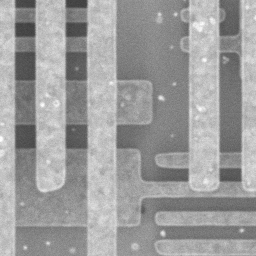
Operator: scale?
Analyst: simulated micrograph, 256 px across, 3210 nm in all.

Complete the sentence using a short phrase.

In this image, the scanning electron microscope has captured wiring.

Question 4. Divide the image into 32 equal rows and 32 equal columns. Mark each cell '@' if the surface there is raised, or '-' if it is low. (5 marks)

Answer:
@@---@@@---@@@----------@@@---@@
@@---@@@---@@@----------@@@---@@
@@---@@@---@@@----------@@@---@@
@@---@@@---@@@----------@@@---@@
@@---@@@---@@@----------@@@---@@
@@---@@@---@@@----------@@@---@@
@@---@@@---@@@----------@@@---@@
@@---@@@---@@@----------@@@---@@
@@---@@@---@@@----------@@@---@@
@@---@@@---@@@----------@@@---@@
@@---@@@---@@@----------@@@---@@
@@---@@@---@@@----------@@@---@@
@@---@@@---@@@----------@@@---@@
@@---@@@---@@@----------@@@---@@
@@---@@@---@@@----------@@@---@@
@@---@@@---@@@----------@@@---@@
@@---@@@---@@@----------@@@---@@
@@---@@@---@@@----------@@@---@@
@@---@@@---@@@----------@@@---@@
@@---@@@---@@@----------@@@---@@
@@---@@@---@@@----------@@@---@@
@@---@@@---@@@----------@@@---@@
@@---@@@---@@@----------@@@---@@
@@---@@----@@@----------@@@----@
@@---------@@@------------------
@@---------@@@------------------
@@---------@@@------------------
@@---------@@@------------------
@@---------@@@------------------
@@---------@@@------------------
@@---------@@@------------------
@@---------@@@------------------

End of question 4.